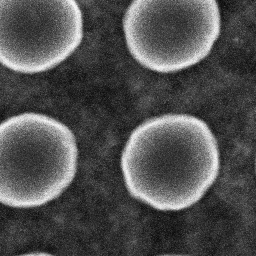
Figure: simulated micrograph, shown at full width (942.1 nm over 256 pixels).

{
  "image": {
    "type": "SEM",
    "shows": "raised bodies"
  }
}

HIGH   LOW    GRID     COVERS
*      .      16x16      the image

*****...*****...
*****...******..
*****...*****...
****.....****...
................
................
................
.**.......**....
****....*****...
*****...*****...
*****...*****...
****....*****...
***......***....
................
................
................